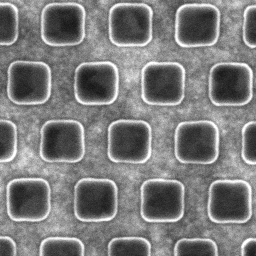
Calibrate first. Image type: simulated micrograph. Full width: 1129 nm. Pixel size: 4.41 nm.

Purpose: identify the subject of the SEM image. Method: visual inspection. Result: a regular array of raised bodies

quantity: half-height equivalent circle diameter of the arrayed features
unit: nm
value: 201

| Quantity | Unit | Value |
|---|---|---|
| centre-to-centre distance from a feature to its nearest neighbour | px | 66.8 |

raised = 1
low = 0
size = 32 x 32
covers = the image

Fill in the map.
00000000000000000000000000000000
11000111111000111110001111100001
11000111111000111110001111100001
11000111110000111110001111100011
11000111110000111110001111100011
10000011110000111100000111000001
00000000000000000000000000000000
00000000000000000000000000000000
01111100001111000011111000011110
01111100011111100011111000111110
01111100011111100011111000111110
01111100011111100011111000111110
01111100001111000011111000011110
00000000000000000000000000000000
00000000000000000000000000000000
11000011110000111100000111100001
11000111110000111110001111100011
11000111110000111110001111100011
11000111110000111110001111100011
11000111110000111110001111100011
00000000000000000000000000000000
00000000000000000000000000000000
00111000000000000000000000000000
01111100011111000011111000111110
01111100011111100011111000111110
01111100011111100011111000111110
01111100011111000011111000111110
00011000001110000001110000011110
00000000000000000000000000000000
00000000000000000000000000000000
11000111110000111110001111100001
11000111110000111110001111100011